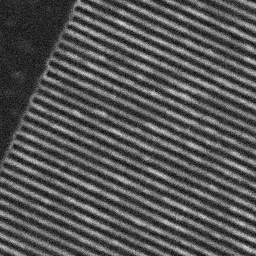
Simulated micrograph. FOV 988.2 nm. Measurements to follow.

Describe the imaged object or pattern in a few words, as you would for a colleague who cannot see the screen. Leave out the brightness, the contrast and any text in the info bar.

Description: parallel lines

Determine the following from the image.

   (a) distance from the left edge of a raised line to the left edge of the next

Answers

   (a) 39.1 nanometers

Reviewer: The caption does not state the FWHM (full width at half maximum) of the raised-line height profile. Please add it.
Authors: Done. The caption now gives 12.7 nm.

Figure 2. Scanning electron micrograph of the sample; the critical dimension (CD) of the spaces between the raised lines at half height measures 25.4 nanometres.